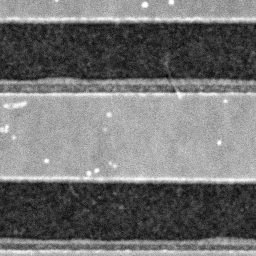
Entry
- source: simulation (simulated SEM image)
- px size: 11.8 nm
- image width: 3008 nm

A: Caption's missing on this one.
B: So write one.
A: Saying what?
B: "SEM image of lines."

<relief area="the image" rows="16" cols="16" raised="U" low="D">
UUUUUUUUUUUUUUUU
DDDDDDDDDDDDDDDD
DDDDDDDDDDDDDDDD
DDDDDDDDDDDDDDDD
DDDDDDDDDDDDDDDD
UUUUUUUUUUUUUUUU
UUUUUUUUUUUUUUUU
UUUUUUUUUUUUUUUU
UUUUUUUUUUUUUUUU
UUUUUUUUUUUUUUUU
UUUUUUUUUUUUUUUU
DDDDDDDDDDDDDDDD
DDDDDDDDDDDDDDDD
DDDDDDDDDDDDDDDD
DDDDDDDDDDDDDDDD
UUUUUUUUUUUUUUUU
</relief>